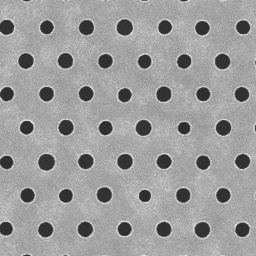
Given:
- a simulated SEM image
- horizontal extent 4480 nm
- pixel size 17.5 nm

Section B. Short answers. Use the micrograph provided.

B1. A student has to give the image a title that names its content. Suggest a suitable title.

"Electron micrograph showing a regular array of holes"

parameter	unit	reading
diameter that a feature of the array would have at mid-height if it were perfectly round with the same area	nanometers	263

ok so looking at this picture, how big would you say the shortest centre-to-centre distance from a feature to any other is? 38.2 pixels